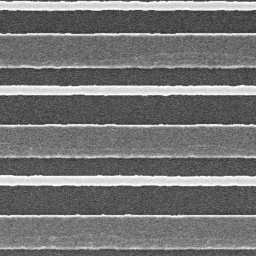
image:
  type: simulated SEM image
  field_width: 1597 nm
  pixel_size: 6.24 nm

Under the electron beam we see lines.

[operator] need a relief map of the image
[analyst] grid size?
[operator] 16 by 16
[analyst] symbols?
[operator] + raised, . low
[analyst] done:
................
................
++++++++++++++++
++++++++++++++++
................
................
................
................
++++++++++++++++
++++++++++++++++
................
................
................
++++++++++++++++
++++++++++++++++
................